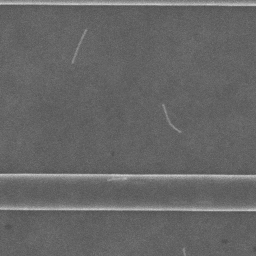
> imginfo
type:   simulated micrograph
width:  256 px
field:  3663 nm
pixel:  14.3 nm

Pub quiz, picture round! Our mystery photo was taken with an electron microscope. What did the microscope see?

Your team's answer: wiring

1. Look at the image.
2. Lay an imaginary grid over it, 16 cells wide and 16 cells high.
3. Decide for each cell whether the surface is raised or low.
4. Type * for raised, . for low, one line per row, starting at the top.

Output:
................
................
................
................
................
................
................
................
................
................
................
****************
****************
................
................
................